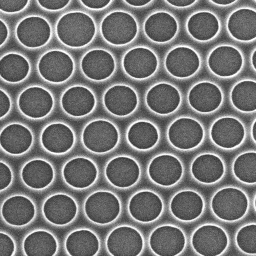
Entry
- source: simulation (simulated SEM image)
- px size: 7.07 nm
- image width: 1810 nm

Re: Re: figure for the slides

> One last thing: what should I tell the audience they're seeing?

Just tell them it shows a regular array of holes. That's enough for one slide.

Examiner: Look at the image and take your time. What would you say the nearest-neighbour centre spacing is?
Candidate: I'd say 292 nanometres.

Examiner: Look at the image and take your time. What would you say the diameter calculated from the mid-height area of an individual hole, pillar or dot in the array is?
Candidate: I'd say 227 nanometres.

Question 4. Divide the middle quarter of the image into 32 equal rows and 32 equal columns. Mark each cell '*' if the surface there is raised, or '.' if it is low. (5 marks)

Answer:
..**.........**........**.......
..***.......***........***......
..***.......****......*****.....
.******....*******..************
********************************
*************..*******.....*****
*.....*****......****.......****
.......***........***........**.
.......***........***........**.
........**........***........**.
........**........***.......****
.......****......*****......****
*.....******....****************
********************************
*******....*******...*******....
.*****.......****......****.....
..***........***.......***......
..***........***.......***......
...**.........**........**......
..***........***.......****.....
..***........****.....******....
.******.....*******.************
********************************
***..********...*******.....****
*......****.......****.......***
........***........***.......***
........**.........**.........**
........***........**........***
........***........***.......***
*......*****......*****.....****
**....*******...****************
********************************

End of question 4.